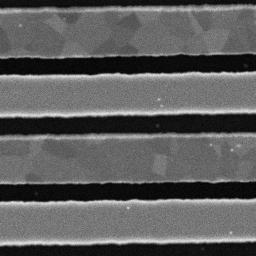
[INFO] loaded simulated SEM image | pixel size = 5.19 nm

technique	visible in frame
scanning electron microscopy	lines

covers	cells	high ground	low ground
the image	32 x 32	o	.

................................
oooooooooooooooooooooooooooooooo
oooooooooooooooooooooooooooooooo
oooooooooooooooooooooooooooooooo
oooooooooooooooooooooooooooooooo
oooooooooooooooooooooooooooooooo
oooooooooooooooooooooooooooooooo
................................
................................
oooooooooooooooooooooooooooooooo
oooooooooooooooooooooooooooooooo
oooooooooooooooooooooooooooooooo
oooooooooooooooooooooooooooooooo
oooooooooooooooooooooooooooooooo
oooooooooo......................
................................
................................
oooooooooooooooooooooooooooooooo
oooooooooooooooooooooooooooooooo
oooooooooooooooooooooooooooooooo
oooooooooooooooooooooooooooooooo
oooooooooooooooooooooooooooooooo
oooooooooooooooooooooooooooooooo
................................
................................
oooooooooooooooooooooooooooooooo
oooooooooooooooooooooooooooooooo
oooooooooooooooooooooooooooooooo
oooooooooooooooooooooooooooooooo
oooooooooooooooooooooooooooooooo
oooooooooooo..oo................
................................